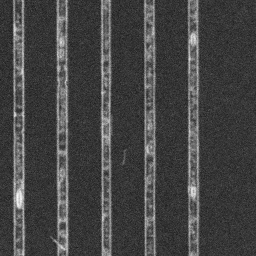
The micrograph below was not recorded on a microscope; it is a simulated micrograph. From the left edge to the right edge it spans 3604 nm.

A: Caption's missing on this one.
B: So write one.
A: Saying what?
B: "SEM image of parallel lines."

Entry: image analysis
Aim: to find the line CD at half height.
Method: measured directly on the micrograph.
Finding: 125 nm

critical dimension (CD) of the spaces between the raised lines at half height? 486 nanometers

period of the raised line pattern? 614 nm